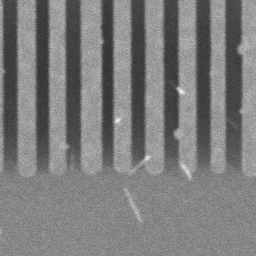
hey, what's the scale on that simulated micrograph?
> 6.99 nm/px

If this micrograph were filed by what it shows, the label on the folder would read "parallel lines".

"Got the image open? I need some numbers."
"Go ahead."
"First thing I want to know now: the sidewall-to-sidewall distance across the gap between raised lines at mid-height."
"0.101 µm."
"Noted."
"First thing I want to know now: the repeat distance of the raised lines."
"223 nanometers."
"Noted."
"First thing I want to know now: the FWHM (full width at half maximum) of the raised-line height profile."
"0.124 microns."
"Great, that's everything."